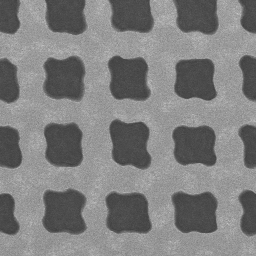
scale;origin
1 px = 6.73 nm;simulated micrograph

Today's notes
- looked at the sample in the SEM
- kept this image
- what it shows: a regular array of holes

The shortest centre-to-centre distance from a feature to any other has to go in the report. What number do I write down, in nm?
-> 436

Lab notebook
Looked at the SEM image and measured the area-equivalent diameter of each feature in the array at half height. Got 0.293 micrometres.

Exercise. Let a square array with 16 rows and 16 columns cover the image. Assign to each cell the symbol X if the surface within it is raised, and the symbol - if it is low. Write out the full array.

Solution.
-XX--XX--XX---X-
-XX--XX--XX---X-
XXXXXXXXXXXXXXXX
XXXXXXXXXXXXXXXX
-XX--XX--XX--XX-
-XX--XX--XX--XX-
XXXXXXXXXXXXXXXX
XXXXXXXXXXXXXXXX
-XX--XX--XX--XX-
-XX--XX--XX--XX-
XXXXXXXXXXXXXXXX
XXXXXXXXXXXXXXXX
-XX--XX--XX--XX-
-XX--XX--XX---X-
-XX--XXXXXXXXXX-
XXXXXXXXXXXXXXXX